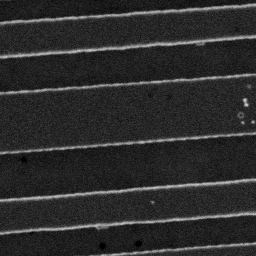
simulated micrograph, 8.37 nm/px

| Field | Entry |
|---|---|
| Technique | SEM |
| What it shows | lines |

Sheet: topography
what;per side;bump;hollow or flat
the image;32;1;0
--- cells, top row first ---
00000000000000000000000000000000
00000000000000000001111111111111
00000111111111111111111111111111
11111111111111111111111111111111
11111111111111111111111111111111
11111111111111111111100000000000
11111111100000000000000000000000
00000000000000000000000000000000
00000000000000000000000000000000
00000000000000000000000000000111
00000000000000001111111111111111
00111111111111111111111111111111
11111111111111111111111111111111
11111111111111111111111111111111
11111111111111111111111111111111
11111111111111111111111111111111
11111111111111111111111111111111
11111111111111111111110000000000
11111111110000000000000000000000
00000000000000000000000000000000
00000000000000000000000000000000
00000000000000000000000000000000
00000000000000000000000000000011
00000000000000000001111111111111
00000001111111111111111111111111
11111111111111111111111111111111
11111111111111111111111111111111
11111111111111111111110000000000
11111111100000000000000000000000
00000000000000000000000000000000
00000000000000000000000000000011
00000000000000000011111111111111